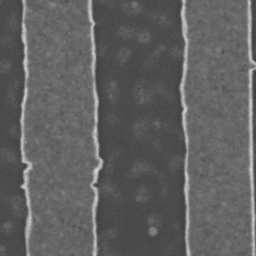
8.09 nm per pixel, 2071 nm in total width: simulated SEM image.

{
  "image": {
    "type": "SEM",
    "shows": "one or a few lines or trenches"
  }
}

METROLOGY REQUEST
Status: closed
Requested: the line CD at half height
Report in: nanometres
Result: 542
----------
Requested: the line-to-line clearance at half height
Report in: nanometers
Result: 737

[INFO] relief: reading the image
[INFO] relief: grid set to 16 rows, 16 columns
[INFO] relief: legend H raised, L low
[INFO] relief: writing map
LHHHHHLLLLLHHHHH
LHHHHHLLLLLLHHHH
LLHHHHLLLLLLHHHH
LLHHHHLLLLLLHHHH
LLHHHHLLLLLLHHHH
LLHHHHLLLLLHHHHH
LHHHHHLLLLLLHHHH
LHHHHHLLLLLLHHHH
LHHHHHLLLLLLHHHH
LHHHHHLLLLLLHHHH
LLHHHHLLLLLLHHHH
LLHHHHLLLLLLHHHH
LLHHHHLLLLLLHHHH
LLHHHHLLLLLLHHHH
LLHHHHLLLLLLHHHH
LLHHHHLLLLLLHHHH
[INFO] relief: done